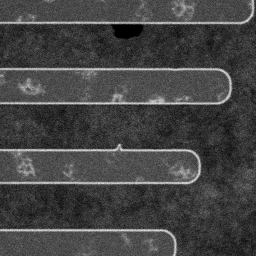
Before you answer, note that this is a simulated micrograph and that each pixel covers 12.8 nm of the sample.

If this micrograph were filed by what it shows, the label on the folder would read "one or a few lines or trenches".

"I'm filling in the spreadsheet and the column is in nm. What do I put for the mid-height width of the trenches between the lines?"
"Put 596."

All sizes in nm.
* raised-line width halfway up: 427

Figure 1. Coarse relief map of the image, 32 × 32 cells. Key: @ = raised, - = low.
@@@@@@@@@@@@@@@@@@@@@@@@@@@@@@@@
@@@@@@@@@@@@@@@@@@@@@@@@@@@@@@@@
@@@@@@@@@@@@@@@@@@@@@@@@@@@@@@@-
--------------------------------
--------------------------------
--------------------------------
--------------------------------
--------------------------------
--------------------------------
@@@@@@@@@@@@@@@@@@@@@@@@@@@@@---
@@@@@@@@@@@@@@@@@@@@@@@@@@@@@---
@@@-@@@@@@@@@@@@@@@@@@@@@@@@@---
@@@@@@@@@@@@@@@@@@@@@@@@@@@@----
--------------------------------
--------------------------------
--------------------------------
--------------------------------
--------------------------------
--------------------------------
@@@@@@@@@@@@@@@@@@@@@@@@@-------
@@@@@@@@@@@@@@@@@@@@@@@@@-------
@@@@@@@@@@@@@@@@@@@@@@@@@-------
@@@@@@@@@@@@@@@@@@@@@@@@--------
--------------------------------
--------------------------------
--------------------------------
--------------------------------
--------------------------------
--------------------------------
@@@@@@@@@@@@@@@@@@@@@@----------
@@@@@@@@@@@@@@@@@@@@@@----------
@@@@@@@@@@@@@@@@@@@@@@----------